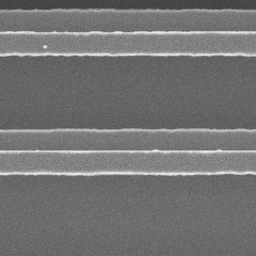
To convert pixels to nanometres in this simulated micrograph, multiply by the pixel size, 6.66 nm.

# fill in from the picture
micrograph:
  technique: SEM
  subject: lines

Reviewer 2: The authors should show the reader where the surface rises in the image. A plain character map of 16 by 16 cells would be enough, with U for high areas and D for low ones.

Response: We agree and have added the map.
DDDDDDDDDDDDDDDD
UUUUUUUUUUUUUUUU
UUUUUUUUUUUUUUUU
DDDDDDDDDDDDDDDD
DDDDDDDDDDDDDDDD
DDDDDDDDDDDDDDDD
DDDDDDDDDDDDDDDD
DDDDDDDDDDDDDDDD
UUUUUUUUUUUUUUUU
UUUUUUUUUUUUUUUU
UUUUUUUUUUUUUUUU
DDDDDDDDDDDDDDDD
DDDDDDDDDDDDDDDD
DDDDDDDDDDDDDDDD
DDDDDDDDDDDDDDDD
DDDDDDDDDDDDDDDD